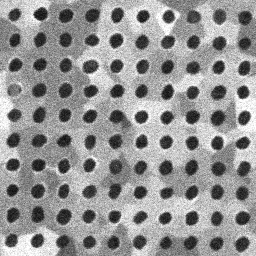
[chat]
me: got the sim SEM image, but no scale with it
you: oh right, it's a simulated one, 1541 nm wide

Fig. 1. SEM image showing a regular array of holes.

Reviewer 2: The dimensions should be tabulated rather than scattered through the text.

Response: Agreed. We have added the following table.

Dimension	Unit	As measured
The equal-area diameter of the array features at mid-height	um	0.0872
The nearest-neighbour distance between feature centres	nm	149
